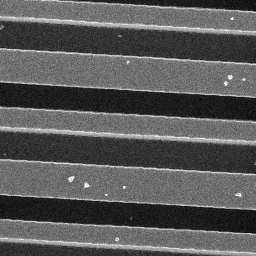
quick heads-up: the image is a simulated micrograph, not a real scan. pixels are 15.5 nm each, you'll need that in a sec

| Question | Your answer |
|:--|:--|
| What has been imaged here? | lines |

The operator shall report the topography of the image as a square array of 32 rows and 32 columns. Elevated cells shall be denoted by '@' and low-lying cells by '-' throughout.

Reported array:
@@@@@@@@@@@@@@------------------
@@@@@@@@@@@@@@@@@@@@@@@@@@@@@@@@
------@@@@@@@@@@@@@@@@@@@@@@@@@@
-----------------------@@@@@@@@@
--------------------------------
--------------------------------
@@@@@@@-------------------------
@@@@@@@@@@@@@@@@@@@@@@@---------
@@@@@@@@@@@@@@@@@@@@@@@@@@@@@@@@
@@@@@@@@@@@@@@@@@@@@@@@@@@@@@@@@
----@@@@@@@@@@@@@@@@@@@@@@@@@@@@
----------------------@@@@@@@@@@
--------------------------------
@-------------------------------
@@@@@@@@@@@@@@@@@@@@------------
@@@@@@@@@@@@@@@@@@@@@@@@@@@@@@@@
---------@@@@@@@@@@@@@@@@@@@@@@@
---------------------------@@@@@
--------------------------------
--------------------------------
@@@@@@@@@@----------------------
@@@@@@@@@@@@@@@@@@@@@@@@@@------
@@@@@@@@@@@@@@@@@@@@@@@@@@@@@@@@
@@@@@@@@@@@@@@@@@@@@@@@@@@@@@@@@
--@@@@@@@@@@@@@@@@@@@@@@@@@@@@@@
--------------------@@@@@@@@@@@@
--------------------------------
--------------------------------
@@@@@@@@@@@@@@@@@@@-------------
@@@@@@@@@@@@@@@@@@@@@@@@@@@@@@@@
-----------@@@@@@@@@@@@@@@@@@@@@
---------------------------@@@@@